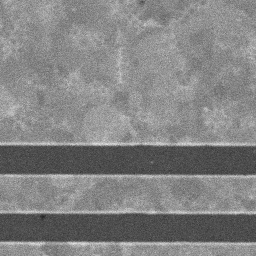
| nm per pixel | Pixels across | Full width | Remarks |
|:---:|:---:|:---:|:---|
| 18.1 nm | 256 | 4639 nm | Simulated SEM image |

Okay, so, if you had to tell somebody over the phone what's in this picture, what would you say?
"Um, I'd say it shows one or a few lines or trenches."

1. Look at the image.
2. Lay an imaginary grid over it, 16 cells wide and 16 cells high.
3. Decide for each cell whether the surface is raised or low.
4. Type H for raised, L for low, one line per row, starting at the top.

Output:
HHHHHHHHHHHHHHHH
HHHHHHHHHHHHHHHH
HHHHHHHHHHHHHHHH
HHHHHHHHHHHHHHHH
HHHHHHHHHHHHHHHH
HHHHHHHHHHHHHHHH
HHHHHHHHHHHHHHHH
HHHHHHHHHHHHHHHH
HHHHHHHHHHHHHHHH
LLLLLLLLLLLLLLLL
LLLLLLLLLLLLLLLL
HHHHHHHHHHHHHHHH
HHHHHHHHHHHHHHHH
LLLLLLLLLLLLLLLL
LLLLLLLLLLLLLLLL
HHHHHHHHHHHHHHHH